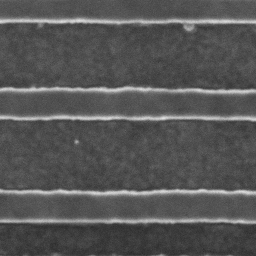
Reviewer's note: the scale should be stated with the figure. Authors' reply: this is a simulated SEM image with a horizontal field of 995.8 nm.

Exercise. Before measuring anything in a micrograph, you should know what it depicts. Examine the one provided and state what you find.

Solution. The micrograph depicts lines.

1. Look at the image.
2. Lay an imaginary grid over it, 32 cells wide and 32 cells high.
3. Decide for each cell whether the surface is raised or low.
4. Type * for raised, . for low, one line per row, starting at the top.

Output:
********************************
********************************
********************************
................................
................................
................................
................................
................................
................................
................................
................................
********************************
********************************
********************************
********************************
................................
................................
................................
................................
................................
................................
................................
................................
................................
********************************
********************************
********************************
********************************
................................
................................
................................
................................